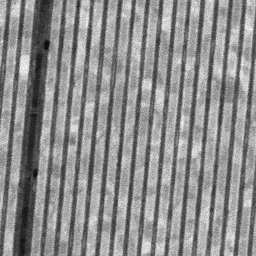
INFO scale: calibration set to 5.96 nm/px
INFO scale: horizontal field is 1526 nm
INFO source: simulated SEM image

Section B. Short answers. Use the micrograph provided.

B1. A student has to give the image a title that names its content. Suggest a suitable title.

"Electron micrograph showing parallel lines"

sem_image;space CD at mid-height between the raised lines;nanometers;32.7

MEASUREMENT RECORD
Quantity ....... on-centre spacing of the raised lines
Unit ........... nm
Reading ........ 82.2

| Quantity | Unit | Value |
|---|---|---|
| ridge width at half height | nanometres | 49.7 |